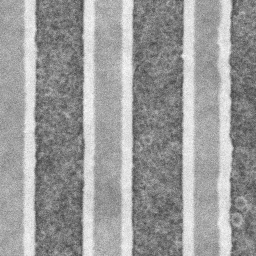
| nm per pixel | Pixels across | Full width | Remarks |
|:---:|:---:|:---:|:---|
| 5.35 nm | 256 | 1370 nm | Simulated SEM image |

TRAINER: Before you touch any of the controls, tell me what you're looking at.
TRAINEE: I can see one or a few lines or trenches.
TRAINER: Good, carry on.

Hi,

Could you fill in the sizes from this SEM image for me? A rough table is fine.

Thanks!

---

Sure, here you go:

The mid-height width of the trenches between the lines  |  0.326 micrometres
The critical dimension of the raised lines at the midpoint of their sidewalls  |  37.5 px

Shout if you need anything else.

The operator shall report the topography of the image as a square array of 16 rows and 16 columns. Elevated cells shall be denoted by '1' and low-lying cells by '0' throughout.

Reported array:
1100001100001100
1100001100001100
1100001100001100
1100001100001100
1100001100001100
1100001100001100
1100001100001100
1100001100001100
1100001100001100
1100001100001100
1100001100001100
1100001100001100
1100001100001100
1100001100001100
1100001100001100
1100001100001100